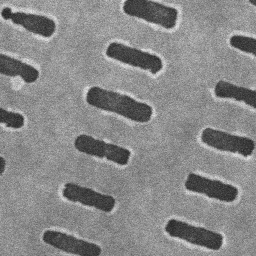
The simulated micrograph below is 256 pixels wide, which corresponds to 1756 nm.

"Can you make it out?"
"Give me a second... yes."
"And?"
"a regular array of holes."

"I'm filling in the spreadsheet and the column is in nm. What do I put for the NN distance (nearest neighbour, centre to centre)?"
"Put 338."